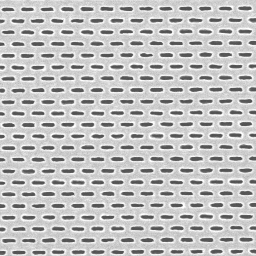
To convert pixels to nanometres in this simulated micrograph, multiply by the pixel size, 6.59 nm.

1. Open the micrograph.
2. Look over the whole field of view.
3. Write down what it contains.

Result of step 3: a regular array of holes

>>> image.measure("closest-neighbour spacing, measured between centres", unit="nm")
98